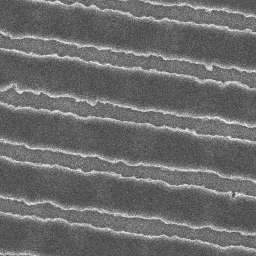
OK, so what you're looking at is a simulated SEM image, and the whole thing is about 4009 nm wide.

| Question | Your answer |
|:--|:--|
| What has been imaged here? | parallel lines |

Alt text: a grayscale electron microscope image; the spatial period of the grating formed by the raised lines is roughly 846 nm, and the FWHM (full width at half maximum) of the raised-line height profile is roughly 612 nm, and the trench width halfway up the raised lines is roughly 232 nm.